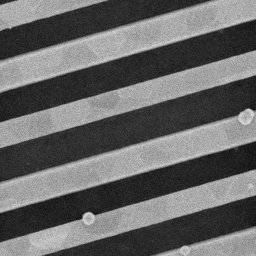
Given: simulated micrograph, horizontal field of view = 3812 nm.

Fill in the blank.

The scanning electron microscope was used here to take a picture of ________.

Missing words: lines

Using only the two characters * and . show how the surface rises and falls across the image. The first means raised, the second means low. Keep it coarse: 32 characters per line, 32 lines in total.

.***********.............*******
********..............**********
*****.............**************
*..............*************....
...........**************.......
........*************...........
....**************.............*
.*************..............****
***********.............********
*******.............***********.
****.............***********....
.............***********........
..........***********...........
.......***********..............
...***********................**
***********...............******
*******................*********
****...............*************
................*************...
............*************.......
........**************..........
.....*************.............*
.**************............*****
***********.............********
*******.............***********.
****.............***********....
*............***********........
..........***********...........
.......***********..............
...***********..............****
**********...............*******
*******..............***********